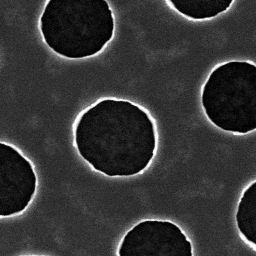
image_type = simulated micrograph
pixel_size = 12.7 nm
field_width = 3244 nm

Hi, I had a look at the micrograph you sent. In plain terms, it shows holes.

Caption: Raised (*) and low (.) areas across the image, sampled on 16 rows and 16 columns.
***....****...**
***....*********
***....*********
****..**********
*************...
*************...
******..*****...
*****....****...
*****.....******
.****.....******
..****...*******
..**************
..*************.
***************.
********...****.
*******.....****